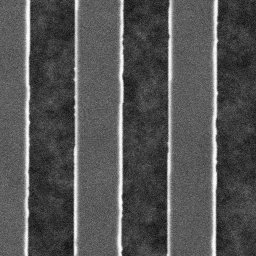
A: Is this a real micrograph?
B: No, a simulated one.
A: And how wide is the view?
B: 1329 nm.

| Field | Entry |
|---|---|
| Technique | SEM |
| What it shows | lines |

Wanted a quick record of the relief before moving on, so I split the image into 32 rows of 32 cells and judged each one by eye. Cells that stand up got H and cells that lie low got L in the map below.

HHHHLLLLLHHHHHHLLLLLLHHHHHHLLLLL
HHHHLLLLLHHHHHHLLLLLLHHHHHHLLLLL
HHHHLLLLLHHHHHHLLLLLLHHHHHHLLLLL
HHHHLLLLLHHHHHHLLLLLLHHHHHHLLLLL
HHHHLLLLLHHHHHHLLLLLLHHHHHHLLLLL
HHHHLLLLLHHHHHHLLLLLLHHHHHHLLLLL
HHHHLLLLLHHHHHHLLLLLLHHHHHHLLLLL
HHHHLLLLLHHHHHHLLLLLLHHHHHHLLLLL
HHHHLLLLLHHHHHHLLLLLLHHHHHHLLLLL
HHHHLLLLLHHHHHHLLLLLLHHHHHHLLLLL
HHHHLLLLLHHHHHHLLLLLLHHHHHHLLLLL
HHHHLLLLLHHHHHHLLLLLLHHHHHHLLLLL
HHHHLLLLLHHHHHHLLLLLLHHHHHHLLLLL
HHHHLLLLLHHHHHHLLLLLLHHHHHHLLLLL
HHHHLLLLLHHHHHHLLLLLLHHHHHHLLLLL
HHHHLLLLLHHHHHHLLLLLLHHHHHHLLLLL
HHHHLLLLLHHHHHHLLLLLLHHHHHHLLLLL
HHHHLLLLLHHHHHHLLLLLLHHHHHHLLLLL
HHHHLLLLLHHHHHHLLLLLLHHHHHHLLLLL
HHHHLLLLLHHHHHHLLLLLLHHHHHHLLLLL
HHHHLLLLLHHHHHHLLLLLLHHHHHHLLLLL
HHHHLLLLLHHHHHHLLLLLLHHHHHHLLLLL
HHHHLLLLLHHHHHHLLLLLLHHHHHHLLLLL
HHHHLLLLLHHHHHHLLLLLLHHHHHHLLLLL
HHHHLLLLLHHHHHHLLLLLLHHHHHHLLLLL
HHHLLLLLLHHHHHHLLLLLLHHHHHHLLLLL
HHHLLLLLLHHHHHHLLLLLLHHHHHHLLLLL
HHHLLLLLLHHHHHHLLLLLLHHHHHHLLLLL
HHHLLLLLLHHHHHHLLLLLLHHHHHHLLLLL
HHHLLLLLLHHHHHHLLLLLLHHHHHHLLLLL
HHHLLLLLLHHHHHHLLLLLLHHHHHHLLLLL
HHHLLLLLLHHHHHHLLLLLLHHHHHHLLLLL